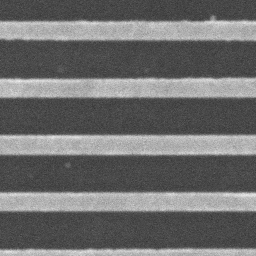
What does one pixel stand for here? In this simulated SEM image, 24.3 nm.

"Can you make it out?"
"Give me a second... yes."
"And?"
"lines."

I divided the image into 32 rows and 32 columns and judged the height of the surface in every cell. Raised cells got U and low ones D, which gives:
DDDDDDDDDDDDDDDDDDDDDDDDDDDDDDDD
DDDDDDDDDDDDDDDDDDDDDDDDDDDDDDDD
DDDDDDDDDDDDDDDDDDDDDDDDDDDDDDDD
UUUUUUUUUUUUUUUUUUUUUUUUUUUUUUUU
UUUUUUUUUUUUUUUUUUUUUUUUUUUUUUUU
DDDDDDDDDDDDDDDDDDDDDDDDDDDDDDDD
DDDDDDDDDDDDDDDDDDDDDDDDDDDDDDDD
DDDDDDDDDDDDDDDDDDDDDDDDDDDDDDDD
DDDDDDDDDDDDDDDDDDDDDDDDDDDDDDDD
DDDDDDDDDDDDDDDDDDDDDDDDDDDDDDDD
UUUUUUUUUUUUUUUUUUUUUUUUUUUUUUUU
UUUUUUUUUUUUUUUUUUUUUUUUUUUUUUUU
DDDDDDDDDDDDDDDDDDDDDDDDDDDDDDDD
DDDDDDDDDDDDDDDDDDDDDDDDDDDDDDDD
DDDDDDDDDDDDDDDDDDDDDDDDDDDDDDDD
DDDDDDDDDDDDDDDDDDDDDDDDDDDDDDDD
DDDDDDDDDDDDDDDDDDDDDDDDDDDDDDDD
UUUUUUUUUUUUUUUUUUUUUUUUUUUUUUUU
UUUUUUUUUUUUUUUUUUUUUUUUUUUUUUUU
DDDDDDDDDDDDDDDDDDDDDDDDDDDDDDDD
DDDDDDDDDDDDDDDDDDDDDDDDDDDDDDDD
DDDDDDDDDDDDDDDDDDDDDDDDDDDDDDDD
DDDDDDDDDDDDDDDDDDDDDDDDDDDDDDDD
DDDDDDDDDDDDDDDDDDDDDDDDDDDDDDDD
UUUUUUUUUUUUUUUUUUUUUUUUUUUUUUUU
UUUUUUUUUUUUUUUUUUUUUUUUUUUUUUUU
DDDDDDDDDDDDDDDDDDDDDDDDDDDDDDDD
DDDDDDDDDDDDDDDDDDDDDDDDDDDDDDDD
DDDDDDDDDDDDDDDDDDDDDDDDDDDDDDDD
DDDDDDDDDDDDDDDDDDDDDDDDDDDDDDDD
DDDDDDDDDDDDDDDDDDDDDDDDDDDDDDDD
UUUUUUUUUUUUUUUUUUUUUUUUUUUUUUUU